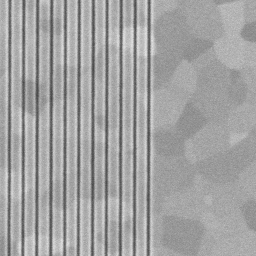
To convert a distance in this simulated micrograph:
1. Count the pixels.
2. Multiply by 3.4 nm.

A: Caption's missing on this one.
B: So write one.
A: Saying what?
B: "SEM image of parallel lines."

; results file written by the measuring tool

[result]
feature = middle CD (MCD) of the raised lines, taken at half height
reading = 33.1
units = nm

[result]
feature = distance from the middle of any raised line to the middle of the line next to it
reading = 13.9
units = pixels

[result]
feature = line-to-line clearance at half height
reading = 13.2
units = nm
